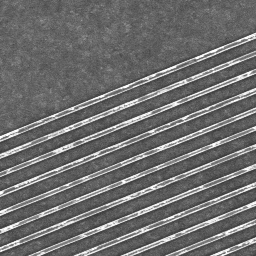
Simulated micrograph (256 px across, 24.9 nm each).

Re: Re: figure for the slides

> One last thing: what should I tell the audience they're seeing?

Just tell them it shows parallel lines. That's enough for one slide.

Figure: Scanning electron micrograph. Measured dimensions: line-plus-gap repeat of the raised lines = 429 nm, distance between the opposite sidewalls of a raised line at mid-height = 0.107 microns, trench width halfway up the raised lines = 12.9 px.